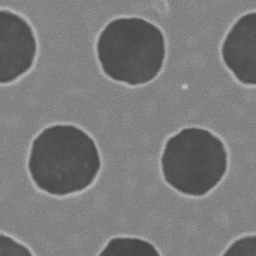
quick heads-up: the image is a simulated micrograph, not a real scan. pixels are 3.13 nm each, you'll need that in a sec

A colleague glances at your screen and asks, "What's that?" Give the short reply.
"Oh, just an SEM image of holes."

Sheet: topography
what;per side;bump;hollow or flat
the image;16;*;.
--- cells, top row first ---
****************
..*****..******.
..****....****..
..****....****..
..*****...*****.
****************
****************
****************
**....*****..***
**....****....**
**....****....**
**....*****...**
****************
****************
****************
..*****...****..